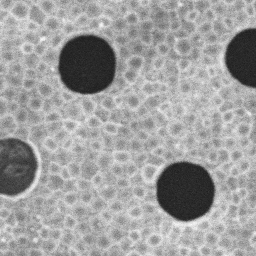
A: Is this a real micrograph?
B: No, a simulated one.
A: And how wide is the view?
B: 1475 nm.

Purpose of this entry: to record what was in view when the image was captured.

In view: holes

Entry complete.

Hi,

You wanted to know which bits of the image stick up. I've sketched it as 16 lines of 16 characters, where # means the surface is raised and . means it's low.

################
################
####..########..
####...#######..
####...#######..
####...#########
################
################
################
..##############
..########...###
..########...###
##########...###
###########..###
################
################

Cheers